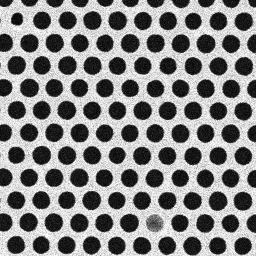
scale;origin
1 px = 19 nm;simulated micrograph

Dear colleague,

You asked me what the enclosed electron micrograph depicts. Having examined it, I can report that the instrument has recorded a regular array of holes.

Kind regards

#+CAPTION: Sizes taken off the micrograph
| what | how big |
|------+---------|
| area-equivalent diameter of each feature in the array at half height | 345 nm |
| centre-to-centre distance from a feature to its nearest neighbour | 476 nm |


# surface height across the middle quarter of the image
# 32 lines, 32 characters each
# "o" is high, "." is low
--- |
...oo....oo.....o.....oo....oo..
...oo....oo....ooo....oo....oo..
..oooo..ooooo.ooooo..oooo..oooo.
oooooooooooooooooooooooooooooooo
oo...oooo...ooo...ooo...oooo...o
oo....oo....oo.....oo....oo....o
oo....oo.....o.....oo....oo....o
oo...ooo....ooo...ooo....oo....o
oooooooooooooooooooooooooooooooo
..oooo..oooo..ooooo.oooooooooooo
...oo....oo....ooo....oo....oo..
...oo....oo.....o.....oo....oo..
...oo....oo....ooo....oo....oo..
..oooo..oooo...ooo...ooo...oooo.
oooooooooooooooooooooooooooooooo
oo...oooo..oooo...ooo...oooo..oo
oo....oo....oo.....oo....oo....o
oo....oo....oo.....o.....oo....o
oo....oo....ooo...ooo....oo....o
ooo..ooooooooooo.ooooo..oooo..oo
ooooooo.oooooooooooooooooooooooo
...oo....ooo...ooo...ooo....ooo.
...oo....oo....oo.....oo....oo..
...oo....oo....oo.....oo....oo..
..ooo....ooo...ooo...ooo....ooo.
oooooooooooooooooooooooooooooooo
oo...oooo..ooooo.ooooo.ooooo..oo
oo....oo....oo....ooo....oo....o
o.....oo....oo.....o.....oo....o
oo....oo....oo....oo.....oo....o
ooo..oooo..oooo..oooo...oooo..oo
oooooooooooooooooooooooooooooooo